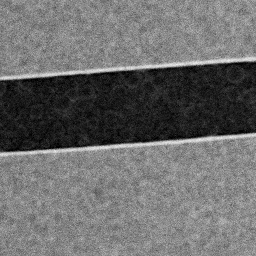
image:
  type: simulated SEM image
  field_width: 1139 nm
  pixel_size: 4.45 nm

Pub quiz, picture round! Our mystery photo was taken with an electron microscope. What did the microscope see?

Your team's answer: one or a few lines or trenches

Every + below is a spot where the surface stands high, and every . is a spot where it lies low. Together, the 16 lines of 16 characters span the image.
++++++++++++++++
++++++++++++++++
++++++++++++++++
++++++++++++++++
+++++...........
................
................
................
...............+
...+++++++++++++
++++++++++++++++
++++++++++++++++
++++++++++++++++
++++++++++++++++
++++++++++++++++
++++++++++++++++